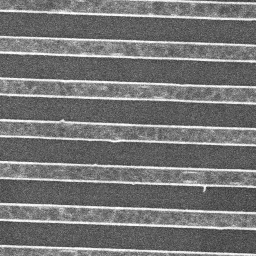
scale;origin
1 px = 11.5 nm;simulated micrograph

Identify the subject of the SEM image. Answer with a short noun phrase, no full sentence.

parallel lines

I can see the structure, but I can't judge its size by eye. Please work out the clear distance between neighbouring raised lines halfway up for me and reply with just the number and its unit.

286 nanometres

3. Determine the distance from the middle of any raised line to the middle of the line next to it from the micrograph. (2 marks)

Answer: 482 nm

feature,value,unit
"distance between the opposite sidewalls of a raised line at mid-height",16.4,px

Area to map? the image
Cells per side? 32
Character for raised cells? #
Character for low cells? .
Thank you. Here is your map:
################################
......##########################
................................
................................
................................
##########################......
################################
.........................#######
................................
................................
###################.............
################################
.....................###########
................................
................................
############....................
################################
...........#.###################
................................
................................
#####...........................
################################
.......#########################
................................
................................
................................
##########################......
################################
...........................#####
................................
................................
######################..........